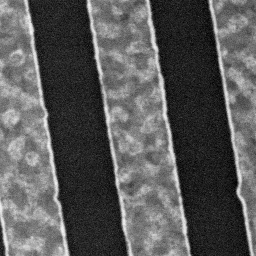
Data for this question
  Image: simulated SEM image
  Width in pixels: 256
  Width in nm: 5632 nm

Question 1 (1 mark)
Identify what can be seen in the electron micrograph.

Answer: one or a few lines or trenches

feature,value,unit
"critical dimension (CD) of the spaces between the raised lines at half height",1350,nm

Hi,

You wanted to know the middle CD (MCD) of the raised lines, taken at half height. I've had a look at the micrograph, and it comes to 1.29 um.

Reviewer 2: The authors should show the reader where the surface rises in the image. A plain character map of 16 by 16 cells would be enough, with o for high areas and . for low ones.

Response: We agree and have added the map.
oo....ooo....ooo
oo....ooo....ooo
oo....oooo....oo
oo....oooo....oo
oo....oooo....oo
oo....oooo....oo
ooo....ooo....oo
ooo....ooo....oo
ooo....oooo....o
ooo....oooo....o
ooo....oooo....o
ooo....oooo....o
oooo....ooo....o
oooo....ooo....o
oooo....oooo....
oooo....oooo....